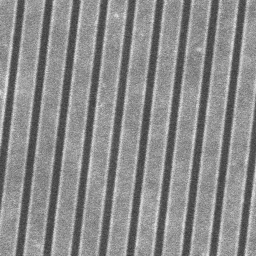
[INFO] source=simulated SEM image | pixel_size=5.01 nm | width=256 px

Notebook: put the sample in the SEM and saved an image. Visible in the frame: parallel lines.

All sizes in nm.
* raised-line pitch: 138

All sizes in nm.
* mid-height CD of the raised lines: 95.8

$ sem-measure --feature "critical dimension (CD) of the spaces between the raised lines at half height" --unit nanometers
41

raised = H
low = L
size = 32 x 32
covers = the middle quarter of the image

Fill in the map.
LLHHHHHLLHHHHHLLHHHHHLLHHHHHLLHH
LLHHHHHLLHHHHHLLHHHHHLLHHHHHLLHH
LLHHHHHLLHHHHHLLHHHHHLLHHHHHLLHH
LLHHHHHLLHHHHHLLHHHHHLLHHHHHLLHH
LLHHHHHLLHHHHLLLHHHHHLLHHHHLLLHH
LLHHHHLLLHHHHLLLHHHHLLLHHHHLLLHH
LLHHHHLLLHHHHLLLHHHHLLLHHHHLLHHH
LLHHHHLLHHHHHLLLHHHHLLHHHHHLLHHH
LLHHHHLLHHHHHLLHHHHHLLHHHHHLLHHH
LHHHHHLLHHHHHLLHHHHHLLHHHHHLLHHH
LHHHHHLLHHHHHLLHHHHHLLHHHHHLLHHH
LHHHHHLLHHHHHLLHHHHHLLHHHHHLLHHH
LHHHHHLLHHHHHLLHHHHHLLHHHHLLLHHH
LHHHHHLLHHHHLLLHHHHLLLHHHHLLLHHH
LHHHHLLLHHHHLLLHHHHLLLHHHHLLHHHH
LHHHHLLLHHHHLLLHHHHLLHHHHHLLHHHH
LHHHHLLHHHHHLLLHHHHLLHHHHHLLHHHH
HHHHHLLHHHHHLLHHHHHLLHHHHHLLHHHH
HHHHHLLHHHHHLLHHHHHLLHHHHHLLHHHH
HHHHHLLHHHHHLLHHHHHLLHHHHHLLHHHH
HHHHHLLHHHHHLLHHHHHLLHHHHHLLHHHH
HHHHHLLHHHHLLLHHHHHLLHHHHLLLHHHH
HHHHLLLHHHHLLLHHHHLLLHHHHLLLHHHH
HHHHLLLHHHHLLHHHHHLLLHHHHLLHHHHH
HHHHLLHHHHHLLHHHHHLLHHHHHLLHHHHH
HHHHLLHHHHHLLHHHHHLLHHHHHLLHHHHH
HHHHLLHHHHHLLHHHHHLLHHHHHLLHHHHH
HHHHLLHHHHHLLHHHHHLLHHHHHLLHHHHH
HHHHLLHHHHHLLHHHHHLLHHHHHLLHHHHL
HHHHLLHHHHHLLHHHHHLLHHHHLLLHHHHL
HHHHLLHHHHLLLHHHHLLLHHHHLLLHHHHL
HHHLLLHHHHLLLHHHHLLLHHHHLLHHHHHL